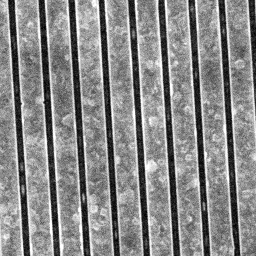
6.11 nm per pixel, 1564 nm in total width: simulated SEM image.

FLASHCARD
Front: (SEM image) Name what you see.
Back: parallel lines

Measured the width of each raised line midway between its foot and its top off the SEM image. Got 139 nm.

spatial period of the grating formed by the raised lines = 0.183 microns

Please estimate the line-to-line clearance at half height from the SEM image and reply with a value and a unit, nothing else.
44.9 nanometres